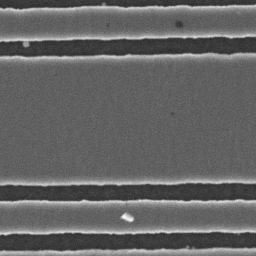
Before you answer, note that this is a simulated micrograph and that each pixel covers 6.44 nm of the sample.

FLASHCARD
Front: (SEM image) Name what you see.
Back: lines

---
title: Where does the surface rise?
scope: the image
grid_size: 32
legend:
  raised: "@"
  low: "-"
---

--------------------------------
@@@@@@@@@@@@@@@@@@@@@@@@@@@@@@@@
@@@@@@@@@@@@@@@@@@@@@@@@@@@@@@@@
@@@@@@@@@@@@@@@@@@@@@@@@@@@@@@@@
@@@@@@@@@@@@@@@@@@@@@@@@@@@@@@@@
--------------------------------
--------------------------------
@@@@@@@@@@@@@@@@@@@@@@@@@@@@@@@@
@@@@@@@@@@@@@@@@@@@@@@@@@@@@@@@@
@@@@@@@@@@@@@@@@@@@@@@@@@@@@@@@@
@@@@@@@@@@@@@@@@@@@@@@@@@@@@@@@@
@@@@@@@@@@@@@@@@@@@@@@@@@@@@@@@@
@@@@@@@@@@@@@@@@@@@@@@@@@@@@@@@@
@@@@@@@@@@@@@@@@@@@@@@@@@@@@@@@@
@@@@@@@@@@@@@@@@@@@@@@@@@@@@@@@@
@@@@@@@@@@@@@@@@@@@@@@@@@@@@@@@@
@@@@@@@@@@@@@@@@@@@@@@@@@@@@@@@@
@@@@@@@@@@@@@@@@@@@@@@@@@@@@@@@@
@@@@@@@@@@@@@@@@@@@@@@@@@@@@@@@@
@@@@@@@@@@@@@@@@@@@@@@@@@@@@@@@@
@@@@@@@@@@@@@@@@@@@@@@@@@@@@@@@@
@@@@@@@@@@@@@@@@@@@@@@@@@@@@@@@@
@@@@@@@@@@@@@@@@@@@@@@@@@@@@@@@@
--------------------------------
--------------------------------
@@@@@@@@@@@@@@@@@@@@@@@@@@@@@@@@
@@@@@@@@@@@@@@@@@@@@@@@@@@@@@@@@
@@@@@@@@@@@@@@@@@@@@@@@@@@@@@@@@
@@@@@@@@@@@@@@@@@@@@@@@@@@@@@@@@
--------------------------------
--------------------------------
@@@@@@@@@@@@@@@@@@@@@@@@@@@@@@@@